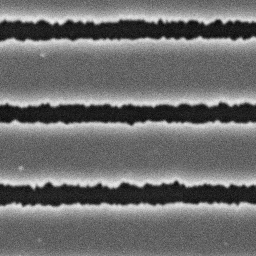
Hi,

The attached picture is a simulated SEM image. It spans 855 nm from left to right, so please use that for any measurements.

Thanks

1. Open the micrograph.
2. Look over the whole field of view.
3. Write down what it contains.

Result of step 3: lines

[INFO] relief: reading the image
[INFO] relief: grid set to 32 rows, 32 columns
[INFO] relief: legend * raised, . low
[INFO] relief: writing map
********************************
********************************
***************...**************
................................
................................
********************************
********************************
********************************
********************************
********************************
********************************
********************************
********************************
................................
................................
****************.***************
********************************
********************************
********************************
********************************
********************************
********************************
********************************
................................
................................
.*....................*..***..*.
********************************
********************************
********************************
********************************
********************************
********************************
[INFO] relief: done